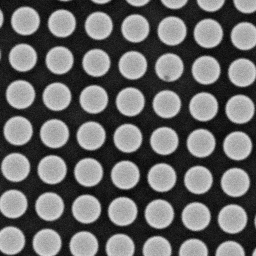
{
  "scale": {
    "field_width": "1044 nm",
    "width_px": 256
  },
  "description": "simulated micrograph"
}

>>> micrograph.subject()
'an array of small figures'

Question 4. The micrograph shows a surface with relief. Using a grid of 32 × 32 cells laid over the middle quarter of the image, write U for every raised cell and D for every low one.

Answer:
UUDDDUUUUUUDDDUUUUUUUDDUUUUUUUDD
UDDDDUUUUUUDDDUUUUUUDDDUUUUUUUDD
DDDDDDUUUUDDDDDUUUUUDDDUUUUUUDDD
DDDDDDDDDDDDDDDDUUUDDDDDUUUUUDDD
DDDDDDDDDDDDDDDDDDDDDDDDDDDDDDDD
DDDDDDDUUDDDDDDDDDDDDDDDDDDDDDDD
UDDDDUUUUUDDDDDUUUDDDDDDDDDDDDDD
UUDDUUUUUUUDDDUUUUUDDDDUUUUUDDDD
UUDDUUUUUUUDDUUUUUUUDDDUUUUUUDDD
UUDDUUUUUUUDDUUUUUUUDDUUUUUUUDDD
UDDDUUUUUUDDDUUUUUUUDDUUUUUUUDDU
DDDDDUUUUUDDDDUUUUUDDDDUUUUUUDDU
DDDDDDDDDDDDDDDUUUDDDDDUUUUUDDDD
DDDDDDDDDDDDDDDDDDDDDDDDDDDDDDDD
DDDDDDDDDDDDDDDDDDDDDDDDDDDDDDDD
UDDDUUUUUDDDDDUUUDDDDDDDDDDDDDDD
UDDDUUUUUUDDDUUUUUUDDDDUUUUDDDDD
UDDUUUUUUUDDDUUUUUUDDDUUUUUUDDDD
UDDUUUUUUUDDDUUUUUUDDDUUUUUUDDDU
DDDDUUUUUUDDDUUUUUUDDDUUUUUUDDDU
DDDDUUUUUDDDDUUUUUUDDDUUUUUUDDDU
DDDDDDDDDDDDDDUUUUDDDDUUUUUUDDDU
DDDDDDDDDDDDDDDDDDDDDDDDUUDDDDDD
DDDDDDDDDDDDDDDDDDDDDDDDDDDDDDDD
DDDDUUUUDDDDDDUUUDDDDDDDDDDDDDDD
DDDUUUUUUDDDDUUUUUDDDDDUUUDDDDDD
DDDUUUUUUUDDUUUUUUUDDDUUUUUDDDDU
DDDUUUUUUUDDUUUUUUUDDUUUUUUUDDDU
DDDUUUUUUDDDUUUUUUUDDUUUUUUUDDUU
DDDDUUUUUDDDUUUUUUDDDUUUUUUUDDUU
DDDDDDUDDDDDDUUUUUDDDDUUUUUDDDUU
DDDDDDDDDDDDDDDDDDDDDDDUUUDDDDDU